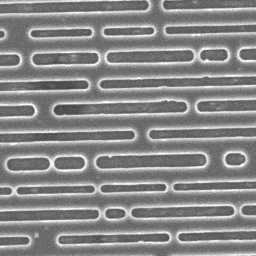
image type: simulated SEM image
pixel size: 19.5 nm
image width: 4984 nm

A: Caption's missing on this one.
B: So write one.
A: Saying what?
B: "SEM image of parallel lines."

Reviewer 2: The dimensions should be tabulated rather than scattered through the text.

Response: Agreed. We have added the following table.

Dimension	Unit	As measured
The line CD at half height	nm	309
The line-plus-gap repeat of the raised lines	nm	504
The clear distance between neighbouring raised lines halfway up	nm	187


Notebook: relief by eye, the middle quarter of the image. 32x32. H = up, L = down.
HHHHHHHHHHHHHHHHHHHHHHHHHHHHHHHH
HHHHHHHHHHHHHHHHHHHHHHHHHHHHHHHH
HHHHHHHHHHHHHHHHHHHHHHHHHHHHHHHH
HHHHHHHHHHHHHHHHHHHHHLHHHHHLLLLL
LLLLLLHHHLLLLLLLLLLLLLLLLLLLLLLL
LLLLLLHHHLLLLLLLLLLLLLLLLLLLLLLL
LLLHHHHHHHHHHHHHHHHHHHHHHHHHHHHH
HHHHHHHHHHHHHHHHHHHHHHHHHHHHHHHH
HHHHHHHHHHHHHHHHHHHHHHHHHHHHHHHH
HHHHHHHHHHHHHHHLLLLLLLLLLLLLLLHH
LLLLLLLLLLLLLLLLLLLLLLLLLLLLLLLH
LLLLLLLLLLLLLLLLLLLLLLLLLLLLLLLH
LLLLLLLLLLLLLLLLLLLHHHHHHHHHHHHH
HHHHHHHHHHHHHHHHHHHHHHHHHHHHHHHH
HHHHHHHHHHHHHHHHHHHHHHHHHHHHHHHH
HHHHHHHHHHHHHHHHHHHHHHHHHHHHHHHH
HHHHHHHHHHHHHHHHHHHHHHLLLLLLLLLL
LLLLLLLLLLLLLLLLLLHHHLLLLLLLLLLL
LLLLLLLLLLLLLLLLLHHHHLLLLLLLLLLL
LHHHHHHHHHHHHHHHHHHHHHHHHHHHHHHH
HHHHHHHHHHHHHHHHHHHHHHHHHHHHHHHH
HHHHHHHHHHHHHHHHHHHHHHHHHHHHHHHH
HHHHHHHHHHHHHHHHHHHHHHHHLLLLLLLL
LLLLLHHHLLLLLLLLLLLLLLLLLLLLLLLL
LLLLLHHHLLLLLLLLLLLLLLLLLLLLLLLL
LLLLLHHHLLLLLLLLLLLLLLLLLLLLLLLL
LLLLHHHHHHHHHHHHHHHHHHHHHHHHHHHH
HHHHHHHHHHHHHHHHHHHHHHHHHHHHHHHH
HHHHHHHHHHHHHHHHHHHHHHHHHHHHHHHH
HHHHHHHHHHHHHHHHHHHHHHHHHHHHHHHH
LLLLLLLHHLLLLLLLLLLLLLLLLLHLLLLL
LLLLLLLLHLLLLLLLLLLLLLLLLHHLLLLL